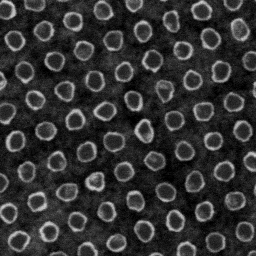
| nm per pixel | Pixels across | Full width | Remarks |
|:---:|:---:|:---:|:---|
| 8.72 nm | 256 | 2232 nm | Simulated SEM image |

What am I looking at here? a regular array of raised bodies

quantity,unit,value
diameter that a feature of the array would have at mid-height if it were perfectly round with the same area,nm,164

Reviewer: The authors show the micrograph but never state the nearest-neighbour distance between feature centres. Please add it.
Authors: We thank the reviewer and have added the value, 265 nm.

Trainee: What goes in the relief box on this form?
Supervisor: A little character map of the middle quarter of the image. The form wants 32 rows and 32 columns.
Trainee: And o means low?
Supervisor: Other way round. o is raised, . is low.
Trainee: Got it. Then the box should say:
..............ooo...oooo........
.............oooo.....o.........
......ooo....oooo..............o
......oooo...oooo.............oo
o.....oooo..............oo....oo
oo....oooo.............oooo...oo
oo.....oo..............oooo.....
oo..............ooo....oooo.....
oo.............oooo.....ooo.....
................ooo.............
.........ooo....ooo.............
........ooooo...................
.ooo....ooooo.............ooo...
.oooo....ooo.............ooooo..
.oooo..............oo....ooooo..
.oooo..............ooo....ooo...
..................oooo..........
...........oo.....oooo..........
..........ooooo....ooo..........
..........ooooo.....o........o..
....ooo...ooooo.............oooo
...ooooo...oo...............oooo
...ooooo.............ooo....oooo
....oooo............ooooo....ooo
o...................ooooo.......
.............oooo....oooo.......
.............oooo.....o.........
.......ooo...oooo...............
......oooo...oooo..............o
......oooo.....................o
ooo...oooo.............oooo...oo
ooo....................ooooo...o